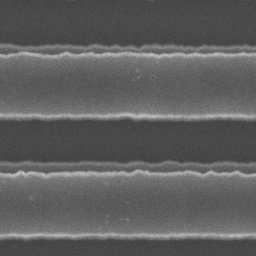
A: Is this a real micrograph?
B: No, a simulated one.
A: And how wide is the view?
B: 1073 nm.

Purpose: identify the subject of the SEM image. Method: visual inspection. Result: lines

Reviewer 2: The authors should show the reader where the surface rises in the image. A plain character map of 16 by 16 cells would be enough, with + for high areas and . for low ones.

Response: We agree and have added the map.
................
................
................
++++++++++++++++
++++++++++++++++
++++++++++++++++
++++++++++++++++
................
................
................
++++++++++++++++
++++++++++++++++
++++++++++++++++
++++++++++++++++
++++++++++++++++
................